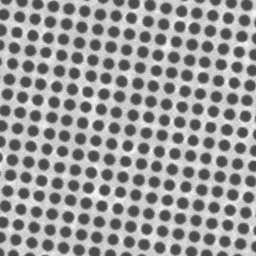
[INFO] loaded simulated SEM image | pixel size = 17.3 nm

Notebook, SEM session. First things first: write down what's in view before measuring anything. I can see a regular array of holes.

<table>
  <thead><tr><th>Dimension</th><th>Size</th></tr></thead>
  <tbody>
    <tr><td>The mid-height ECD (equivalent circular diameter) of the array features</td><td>214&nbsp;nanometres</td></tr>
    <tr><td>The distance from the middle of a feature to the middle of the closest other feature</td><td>0.268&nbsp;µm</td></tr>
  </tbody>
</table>